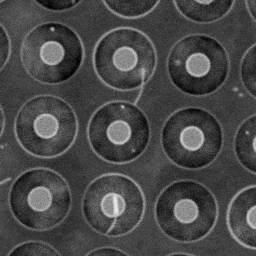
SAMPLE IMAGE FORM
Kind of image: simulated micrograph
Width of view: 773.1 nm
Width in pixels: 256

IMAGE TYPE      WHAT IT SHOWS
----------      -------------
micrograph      an array of small figures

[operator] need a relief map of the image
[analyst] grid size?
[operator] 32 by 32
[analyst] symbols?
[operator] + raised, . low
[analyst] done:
+++++.....+++.......++.......++.
++++++++++++++.....++++.....+++.
++++++++++++++++++++++++...+++++
++++.....+++++++++++++++++++++++
.++.......+++.....++++++..++++++
.++.......++.......+++.....+++++
.++.......++.......++.......+++.
.++.......++.......++........+..
+++.......++.......++........+..
++++.....+++.......++.......++..
+++++++++++++.....++++......++..
+++++++++++++++++++++++....++++.
++++....++++++++++++++++++++++++
+++......++++....+++++++++++++++
++.......+++......+++......+++++
++........+........++......+++..
++........+........+........++..
++.......++........+........+...
+++.....++++......++........+...
+++++..+++++.....++++......+++..
++++++++++++++++++++++....++++..
+++....+++++++++++++++++++++++++
++......++++....++++++++++++++++
++.......++......++++.....+++++.
+........++.......++.......+++..
+........+........++.......++...
++......++........+........++...
++......+++......+++.......+....
++++..++++++.....+++......+++...
+++++++++++++++++++++.....+++...
+++...++++++++++++++++++++++++..
+......++++....+++++++++++++++++